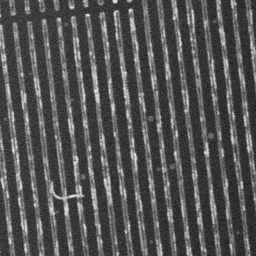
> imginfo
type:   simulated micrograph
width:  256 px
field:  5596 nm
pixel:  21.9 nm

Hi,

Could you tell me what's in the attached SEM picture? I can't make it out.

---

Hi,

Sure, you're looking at parallel lines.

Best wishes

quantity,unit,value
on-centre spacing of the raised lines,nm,319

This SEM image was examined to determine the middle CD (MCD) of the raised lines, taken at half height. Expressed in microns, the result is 0.076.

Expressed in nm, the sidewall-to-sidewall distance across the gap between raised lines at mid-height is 244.